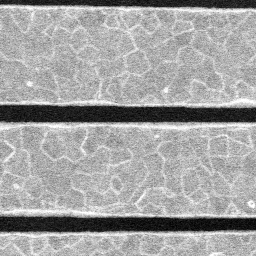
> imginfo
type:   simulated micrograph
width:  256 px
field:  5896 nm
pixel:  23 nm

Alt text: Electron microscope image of lines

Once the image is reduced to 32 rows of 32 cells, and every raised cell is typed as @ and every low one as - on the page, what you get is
--------------------------------
@@@@@@@@@@@@@@@@@@@@@@@@@@@@@@@@
@@@@@@@@@@@@@@@@@@@@@@@@@@@@@@@@
@@@@@@@@@@@@@@@@@@@@@@@@@@@@@@@@
@@@@@@@@@@@@@@@@@@@@@@@@@@@@@@@@
@@@@@@@@@@@@@@@@@@@@@@@@@@@@@@@@
@@@@@@@@@@@@@@@@@@@@@@@@@@@@@@@@
@@@@@@@@@@@@@@@@@@@@@@@@@@@@@@@@
@@@@@@@@@@@@@@@@@@@@@@@@@@@@@@@@
@@@@@@@@@@@@@@@@@@@@@@@@@@@@@@@@
@@@@@@@@@@@@@@@@@@@@@@@@@@@@@@@@
@@@@@@@@@@@@@@@@@@@@@@@@@@@@@@@@
@@@@@@@@@@@@@@@@@@@@@@@@@@@@@@@@
--------------------------------
--------------------------------
--@@@@----@@@@-----------------@
@@@@@@@@@@@@@@@@@@@@@@@@@@@@@@@@
@@@@@@@@@@@@@@@@@@@@@@@@@@@@@@@@
@@@@@@@@@@@@@@@@@@@@@@@@@@@@@@@@
@@@@@@@@@@@@@@@@@@@@@@@@@@@@@@@@
@@@@@@@@@@@@@@@@@@@@@@@@@@@@@@@@
@@@@@@@@@@@@@@@@@@@@@@@@@@@@@@@@
@@@@@@@@@@@@@@@@@@@@@@@@@@@@@@@@
@@@@@@@@@@@@@@@@@@@@@@@@@@@@@@@@
@@@@@@@@@@@@@@@@@@@@@@@@@@@@@@@@
@@@@@@@@@@@@@@@@@@@@@@@@@@@@@@@@
@@@@@@@@@@@@@@@@@@@@@@@@@@@@@@@@
--------------------------------
--------------------------------
@@@@@@@@@@@@@@@@@@@@@@@@@@@@@@@@
@@@@@@@@@@@@@@@@@@@@@@@@@@@@@@@@
@@@@@@@@@@@@@@@@@@@@@@@@@@@@@@@@